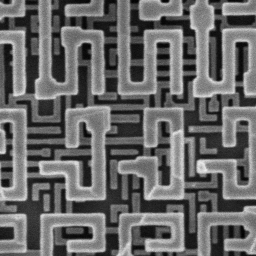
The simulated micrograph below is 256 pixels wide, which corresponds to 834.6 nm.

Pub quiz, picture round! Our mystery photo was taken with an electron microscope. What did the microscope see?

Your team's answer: wiring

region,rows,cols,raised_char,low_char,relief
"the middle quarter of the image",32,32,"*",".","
***....***....**....***....**...
***....***....**....***....**...
***....***....**....***....**...
***....***....**....***....**...
***....***....***...***....**...
***....***....*********....***..
***....***....*********....***..
***....**.....***...............
................................
................................
................................
.**********.........**********..
***********.........**********..
***********.........**********..
****.******.........***...****..
****..*****.........***....***..
****..*****.........***....***..
****...***..........***....***..
****...***..........***....***..
****...***..........***....***..
****...***..........***....***..
.......***.................***..
.......***.................***..
.......***........*****....***..
***....***....*********....***..
****...***....*********....***..
****...***....*********....***..
****...***........*****....***..
****...***..........***....***..
****...***..........***....***..
.***...***..........****..****..
.*********..........**********..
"